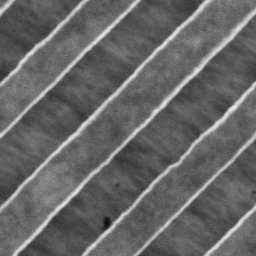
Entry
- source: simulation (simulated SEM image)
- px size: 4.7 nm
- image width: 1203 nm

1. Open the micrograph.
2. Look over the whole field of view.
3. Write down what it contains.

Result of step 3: lines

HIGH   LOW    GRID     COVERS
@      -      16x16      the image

-----@@@----@@@@
----@@@----@@@@-
---@@@----@@@@--
--@@@----@@@@---
-@@@----@@@@----
@@@----@@@@-----
@@----@@@@-----@
@----@@@@-----@@
----@@@@-----@@@
---@@@@-----@@@-
--@@@@-----@@@--
-@@@@----@@@@---
@@@@-----@@@----
@@@-----@@@----@
@@-----@@@----@@
@-----@@@----@@@